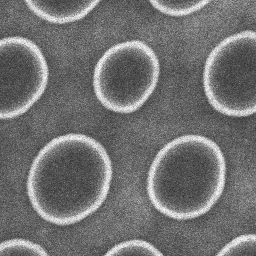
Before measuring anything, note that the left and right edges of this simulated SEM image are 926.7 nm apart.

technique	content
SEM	raised bodies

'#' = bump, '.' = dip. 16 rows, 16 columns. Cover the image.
..####....##....
................
..............##
###....###...###
###...####...###
###...###....###
##.....##....###
................
................
...###....####..
..#####...####..
..#####..#####..
..####....###...
...##......#....
................
##.....##.....##